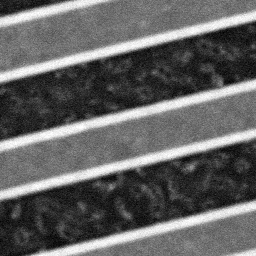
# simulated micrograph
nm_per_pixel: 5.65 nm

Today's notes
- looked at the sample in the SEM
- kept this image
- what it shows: one or a few lines or trenches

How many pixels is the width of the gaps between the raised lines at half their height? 67.3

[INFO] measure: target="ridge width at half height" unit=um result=0.268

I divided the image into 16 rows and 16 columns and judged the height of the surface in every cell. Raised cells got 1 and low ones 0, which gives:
0000111111111111
1111111111111100
1111111111000000
1111110000000000
1000000000000000
0000000000000001
0000000000011111
0000000111111111
0001111111111110
1111111111100000
1111111000000000
1110000000000000
0000000000000000
0000000000000111
0000000001111111
0000011111111111